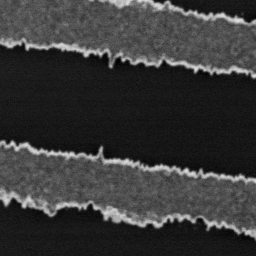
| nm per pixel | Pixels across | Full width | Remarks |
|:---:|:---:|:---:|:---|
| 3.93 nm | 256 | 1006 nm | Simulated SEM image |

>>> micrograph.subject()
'one or a few lines or trenches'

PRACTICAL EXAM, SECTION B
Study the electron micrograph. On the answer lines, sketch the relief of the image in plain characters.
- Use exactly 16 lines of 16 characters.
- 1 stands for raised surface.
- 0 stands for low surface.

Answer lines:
1111111111100000
1111111111111111
1111111111111111
0000000111111111
0000000000000101
0000000000000000
0000000000000000
0000000000000000
0000000000000000
1110000000000000
1111111111100000
1111111111111111
0111111111111111
0000000111111111
0000000000000001
0000000000000000